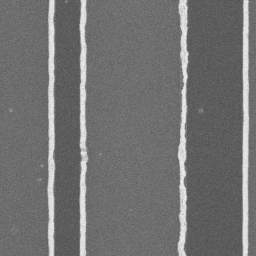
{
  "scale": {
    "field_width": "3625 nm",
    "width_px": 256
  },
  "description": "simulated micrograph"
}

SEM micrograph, one or a few lines or trenches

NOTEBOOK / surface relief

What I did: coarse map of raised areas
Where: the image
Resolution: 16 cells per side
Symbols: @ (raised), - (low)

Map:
---@@------@@@@-
---@@------@@@@-
---@@------@@@@-
---@@-------@@@-
---@@-------@@@-
---@@------@@@@-
---@@-------@@@-
---@@------@@@@-
---@@------@@@@-
---@@------@@@@-
---@@------@@@@-
---@@------@@@@-
---@@-------@@@-
---@@------@@@@-
---@@------@@@@-
---@@------@@@@-